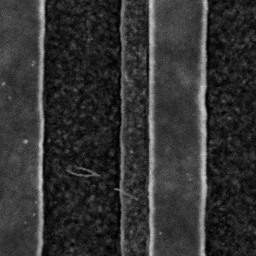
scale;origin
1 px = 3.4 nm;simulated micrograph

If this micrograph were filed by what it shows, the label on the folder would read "lines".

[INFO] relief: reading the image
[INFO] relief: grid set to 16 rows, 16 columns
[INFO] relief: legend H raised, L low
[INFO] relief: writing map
HHHLLLLLLHHHHLLL
HHHLLLLLHHHHHLLL
HHHLLLLLHHHHHLLL
HHHLLLLLHHHHHLLL
HHHLLLLLHHHHHLLL
HHHLLLLLHHHHHLLL
HHHLLLLLHHHHHLLL
HHHLLLLLHHHHHLLL
HHHLLLLLHHHHHLLL
HHHLLLLLLHHHHLLL
HHHLLLLLLHHHHLLL
HHHLLLLLLHHHHLLL
HHHLLLLLHHHHHLLL
HHHLLLLLLHHHHLLL
HHHLLLLLLHHHHLLL
HHHLLLLLLHHHHLLL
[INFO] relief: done